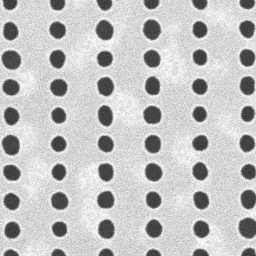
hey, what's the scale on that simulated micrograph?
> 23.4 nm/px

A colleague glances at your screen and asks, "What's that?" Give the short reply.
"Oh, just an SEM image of a regular array of holes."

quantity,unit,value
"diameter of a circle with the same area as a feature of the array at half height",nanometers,412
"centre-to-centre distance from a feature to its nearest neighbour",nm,656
